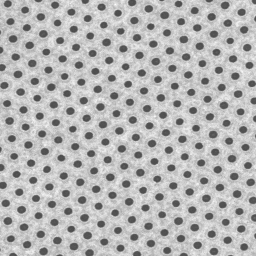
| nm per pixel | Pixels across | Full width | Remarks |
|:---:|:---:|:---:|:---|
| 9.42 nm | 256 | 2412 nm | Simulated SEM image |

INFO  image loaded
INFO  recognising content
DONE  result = a regular array of holes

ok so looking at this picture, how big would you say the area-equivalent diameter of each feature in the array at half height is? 76.7 nanometres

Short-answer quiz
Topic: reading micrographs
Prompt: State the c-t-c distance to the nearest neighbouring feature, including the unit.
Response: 164 nanometers